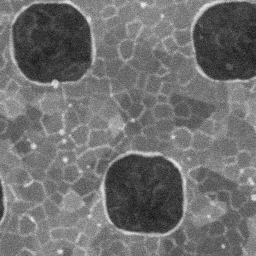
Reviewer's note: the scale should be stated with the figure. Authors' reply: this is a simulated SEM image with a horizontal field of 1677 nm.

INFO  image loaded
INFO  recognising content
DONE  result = holes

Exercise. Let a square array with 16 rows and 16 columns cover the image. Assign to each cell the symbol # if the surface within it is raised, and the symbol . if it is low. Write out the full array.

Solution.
##...########...
#.....######....
#.....######....
#.....######....
#....########...
################
################
################
################
################
#######....#####
######.....#####
#######.....####
#######....#####
########...#####
################